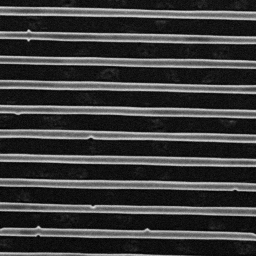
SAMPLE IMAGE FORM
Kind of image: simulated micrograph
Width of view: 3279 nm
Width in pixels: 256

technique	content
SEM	parallel lines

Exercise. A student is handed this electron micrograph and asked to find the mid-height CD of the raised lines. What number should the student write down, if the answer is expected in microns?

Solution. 0.0944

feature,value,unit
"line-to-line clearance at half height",213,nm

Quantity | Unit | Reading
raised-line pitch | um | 0.314